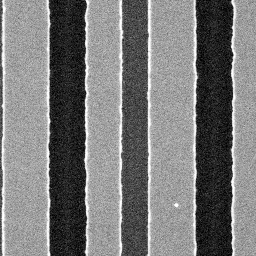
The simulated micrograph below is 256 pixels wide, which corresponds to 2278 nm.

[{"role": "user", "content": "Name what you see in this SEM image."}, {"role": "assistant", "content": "lines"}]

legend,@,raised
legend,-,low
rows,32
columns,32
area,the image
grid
@@@@@@-----@@@@----@@@@@-----@@@
@@@@@@-----@@@@----@@@@@-----@@@
@@@@@@-----@@@@----@@@@@-----@@@
@@@@@@-----@@@@----@@@@@-----@@@
@@@@@@-----@@@@----@@@@@-----@@@
@@@@@@-----@@@@----@@@@@-----@@@
@@@@@@-----@@@@----@@@@@-----@@@
@@@@@@-----@@@@----@@@@@-----@@@
@@@@@@-----@@@@----@@@@@-----@@@
@@@@@@-----@@@@----@@@@@@----@@@
@@@@@@-----@@@@----@@@@@-----@@@
@@@@@@-----@@@@---@@@@@@-----@@@
@@@@@@-----@@@@----@@@@@-----@@@
@@@@@@-----@@@@----@@@@@-----@@@
@@@@@@-----@@@@----@@@@@-----@@@
@@@@@@-----@@@@----@@@@@-----@@@
@@@@@@-----@@@@----@@@@@-----@@@
@@@@@@-----@@@@----@@@@@-----@@@
@@@@@@-----@@@@----@@@@@-----@@@
@@@@@@-----@@@@----@@@@@-----@@@
@@@@@@-----@@@@----@@@@@-----@@@
@@@@@@-----@@@@----@@@@@-----@@@
@@@@@@-----@@@@----@@@@@-----@@@
@@@@@@-----@@@@----@@@@@-----@@@
@@@@@@-----@@@@----@@@@@-----@@@
@@@@@@-----@@@@----@@@@@-----@@@
@@@@@@-----@@@@----@@@@@-----@@@
@@@@@@-----@@@@----@@@@@-----@@@
@@@@@@-----@@@@----@@@@@-----@@@
@@@@@@-----@@@@----@@@@@-----@@@
@@@@@@-----@@@@----@@@@@-----@@@
@@@@@@-----@@@@----@@@@@-----@@@